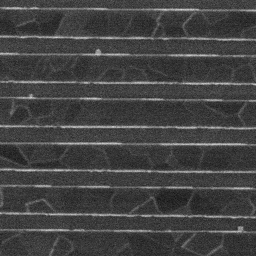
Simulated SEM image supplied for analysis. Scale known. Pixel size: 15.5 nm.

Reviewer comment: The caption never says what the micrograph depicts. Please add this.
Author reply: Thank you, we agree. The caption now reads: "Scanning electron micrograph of lines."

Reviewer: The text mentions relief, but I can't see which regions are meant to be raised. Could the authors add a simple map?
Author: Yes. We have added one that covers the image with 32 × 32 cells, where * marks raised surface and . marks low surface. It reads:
................................
********************************
********************************
********************************
********************************
................................
................................
********************************
********************************
********************************
................................
................................
********************............
********************************
********************************
********************************
................................
................................
********************************
********************************
********************************
................................
................................
***********************.........
********************************
********************************
********************************
................................
................................
********************************
********************************
********************************